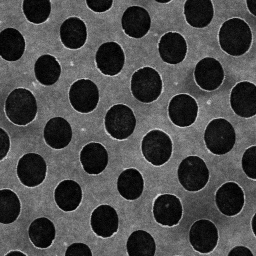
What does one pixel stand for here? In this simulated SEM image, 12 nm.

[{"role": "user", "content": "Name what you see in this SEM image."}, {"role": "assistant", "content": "a regular array of holes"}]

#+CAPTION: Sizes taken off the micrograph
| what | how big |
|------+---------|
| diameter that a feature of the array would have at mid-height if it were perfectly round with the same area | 376 nm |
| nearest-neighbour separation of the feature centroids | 537 nm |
